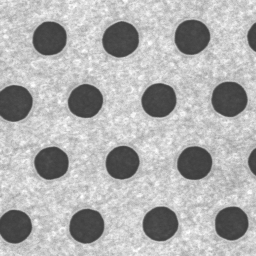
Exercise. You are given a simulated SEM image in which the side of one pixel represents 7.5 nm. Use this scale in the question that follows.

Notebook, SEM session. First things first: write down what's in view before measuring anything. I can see a regular array of holes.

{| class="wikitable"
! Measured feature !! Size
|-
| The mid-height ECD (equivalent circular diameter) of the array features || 260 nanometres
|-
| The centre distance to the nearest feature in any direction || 0.53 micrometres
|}